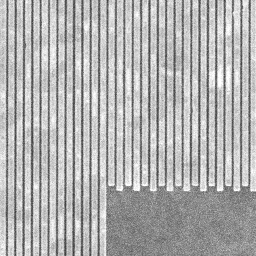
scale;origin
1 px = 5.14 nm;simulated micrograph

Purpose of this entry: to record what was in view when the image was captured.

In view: parallel lines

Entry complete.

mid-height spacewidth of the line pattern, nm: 13.5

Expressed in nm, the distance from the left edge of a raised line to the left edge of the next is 42.8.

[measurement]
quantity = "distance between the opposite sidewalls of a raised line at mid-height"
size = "26.3 nm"